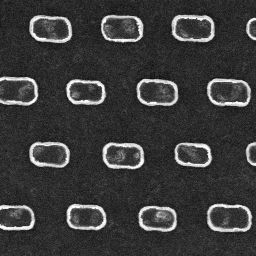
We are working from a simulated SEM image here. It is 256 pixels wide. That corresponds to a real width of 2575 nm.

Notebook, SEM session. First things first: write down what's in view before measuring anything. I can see a regular array of raised bodies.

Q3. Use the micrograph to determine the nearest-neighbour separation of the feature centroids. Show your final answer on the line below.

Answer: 715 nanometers